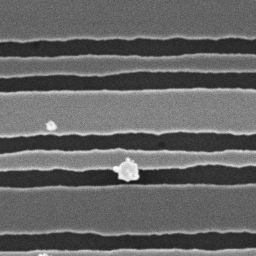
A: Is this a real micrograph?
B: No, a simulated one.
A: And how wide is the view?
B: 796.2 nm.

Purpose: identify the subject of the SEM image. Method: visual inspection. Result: lines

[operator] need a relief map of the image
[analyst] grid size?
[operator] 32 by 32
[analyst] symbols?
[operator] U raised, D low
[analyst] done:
UUUUUUUUUUUUUUUUUUUUUUUUUUUUUUUU
UUUUUUUUUUUUUUUUUUUUUUUUUUUUUUUU
UUUUUUUUUUUUUUUUUUUUUUUUUUUUUUUU
UUUUUUUUUUUUUUUUUUUUUUUUUUUUUUUU
UUUUUUUUUUUUUUUUUUUUUUUUUUUUUUUU
DDDDDDDDDDDDDDDDDDDDDDDDDDDDDDDD
DDDDDDDDDDDDDDDDDDDDDDDDDDDDDDDD
UUUUUUUUUUUUUUUUUUUUUUUUUUUUUUUU
UUUUUUUUUUUUUUUUUUUUUUUUUUUUUUUU
UUUUUDDDDDUUUDDDDDDDDDDDDDDDDDDD
DDDDDDDDDDDDDDDDDDDDDDDDDDDDDDDD
DDUUUUUUUUUUUUUUUUUUUUUUUUUUUUUU
UUUUUUUUUUUUUUUUUUUUUUUUUUUUUUUU
UUUUUUUUUUUUUUUUUUUUUUUUUUUUUUUU
UUUUUUUUUUUUUUUUUUUUUUUUUUUUUUUU
UUUUUUUUUUUUUUUUUUUUUUUUUUUUUUUU
UUUUUUUUUUUUUUUUUUUUUUUUUUUUUUUU
DDDDDDDDDDDDDDDDDDDDDDDDDDDDDDDD
DDDDDDDDDDDDDDDDDDDDDDDDDDDDDDDD
UUUUUUUUUUUUUUUUUUUUUUUUUUUUUUUU
UUUUUUUUUUUUUUUUUUUUUUUUUUUUUUUU
DDDDDDDDDDDDDDUUUDDDDDDDDDDDDDDD
DDDDDDDDDDDDDDDUUDDDDDDDDDDDDDDD
UUDDUUUUUUUUUUUUUUUUUUUUUUUUUUUU
UUUUUUUUUUUUUUUUUUUUUUUUUUUUUUUU
UUUUUUUUUUUUUUUUUUUUUUUUUUUUUUUU
UUUUUUUUUUUUUUUUUUUUUUUUUUUUUUUU
UUUUUUUUUUUUUUUUUUUUUUUUUUUUUUUU
UUUUUUUUUUUUUUUUUUUUUUUUUUUUUUUU
DDDDDDDDDDDDDDDDDDDDDDDDDDDDDDDD
DDDDDDDDDDDDDDDDDDDDDDDDDDDDDDDD
DDDUUUUUUUUUUUUUUUUUUUUUUUUUUUUU